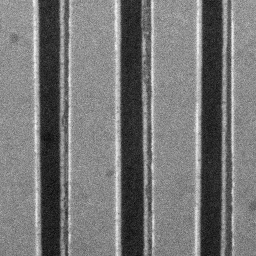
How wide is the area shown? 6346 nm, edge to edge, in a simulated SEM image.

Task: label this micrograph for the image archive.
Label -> lines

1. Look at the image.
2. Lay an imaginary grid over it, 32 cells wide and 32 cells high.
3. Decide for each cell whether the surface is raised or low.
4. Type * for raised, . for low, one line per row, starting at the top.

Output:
****.....******....******....***
****.....******....******....***
****.....******....******....***
****.....******....******....***
****.....******....******....***
****.....******....******....***
****.....******....******....***
****.....******....******....***
****.....******....******....***
****.....******....******....***
****.....******....******....***
****.....******....******....***
****.....******....******....***
****.....******....******....***
****.....******....******....***
****.....******....******....***
****.....******....******....***
****.....******....******....***
****.....******....******....***
****.....******....******....***
*****....******....******....***
*****....******....******....***
*****....******....******....***
*****....******....******....***
*****....******....******....***
*****....******....******....***
*****....******....******....***
*****....******....******....***
*****....******....******....***
*****....******....******....***
*****....******....******....***
*****....******....******....***